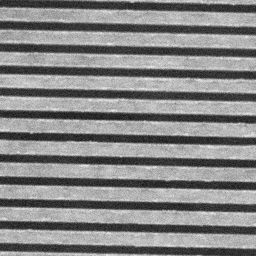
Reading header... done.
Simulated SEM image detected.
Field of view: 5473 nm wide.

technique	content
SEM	parallel lines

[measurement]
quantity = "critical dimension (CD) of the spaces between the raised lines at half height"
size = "8.37 px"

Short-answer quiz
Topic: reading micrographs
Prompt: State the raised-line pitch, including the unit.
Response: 474 nanometres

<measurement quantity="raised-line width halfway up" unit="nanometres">278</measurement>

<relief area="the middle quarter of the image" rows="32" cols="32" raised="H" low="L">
HHHHHHHHHHHHHHHHHHHHHHHHHHHHHHHH
LLLLLLLLLLLLLLLLLLLLLLLLLLLLLLLL
LLLLLLLLLLLLLLLLLLLLLLLLLLLLLLLL
HHHHHHHHHHHHHHHHHHHHHHHHHLLLLLLL
HHHHHHHHHHHHHHHHHHHHHHHHHHHHHHHH
HHHHHHHHHHHHHHHHHHHHHHHHHHHHHHHH
LLLLLLLLLLLLLLHHHHHHHHHHHHHHHHHH
LLLLLLLLLLLLLLLLLLLLLLLLLLLLLLLL
LLLLLLLLLLLLLLLLLLLLLLLLLLLLLLLL
HHHHHHHHHHHHHHHHHHHHHHHHHHHHHHHH
HHHHHHHHHHHHHHHHHHHHHHHHHHHHHHHH
HHHHHHHHHHHHHHHHHHHHHHHHHHHHHHHH
LLLLLLLLLLLLLLLLLLLLLLLLLLLLLLLL
LLLLLLLLLLLLLLLLLLLLLLLLLLLLLLLL
HHHHHHHHHHHHHHHHHHHLHLLLLLLLLLLL
HHHHHHHHHHHHHHHHHHHHHHHHHHHHHHHH
HHHHHHHHHHHHHHHHHHHHHHHHHHHHHHHH
LLLLLLLLLLLLLLLLLLLHHHHHHHHHHHHH
LLLLLLLLLLLLLLLLLLLLLLLLLLLLLLLL
HHHHLLHLLLLLLLLLLLLLLLLLLLLLLLLL
HHHHHHHHHHHHHHHHHHHHHHHHHHHHHHHH
HHHHHHHHHHHHHHHHHHHHHHHHHHHHHHHH
HHHHHHHHHHHHHHHHHHHHHHHHHHHHHHHH
LLLLLLLLLLLLLLLLLLLLLLLLLLLLLLLL
LLLLLLLLLLLLLLLLLLLLLLLLLLLLLLLL
HHHHHHHHHHHHHLLLLLLLLLLLLLLLLLLL
HHHHHHHHHHHHHHHHHHHHHHHHHHHHHHHH
HHHHHHHHHHHHHHHHHHHHHHHHHHHHHHHH
LLLLLLLLLLLLLHHHHHHHHHHHHHHHHHHH
LLLLLLLLLLLLLLLLLLLLLLLLLLLLLLLL
LLLLLLLLLLLLLLLLLLLLLLLLLLLLLLLL
HHHHHHHHHHHHHHHHHHHHHHHHHHHHHHHH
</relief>